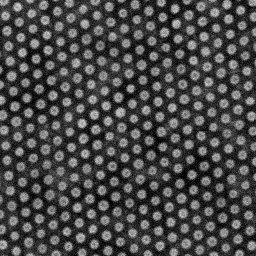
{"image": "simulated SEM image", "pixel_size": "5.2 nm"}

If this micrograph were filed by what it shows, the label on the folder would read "a regular array of raised bodies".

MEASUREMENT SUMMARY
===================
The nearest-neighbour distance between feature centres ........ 0.0774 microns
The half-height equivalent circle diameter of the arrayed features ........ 43.1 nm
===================